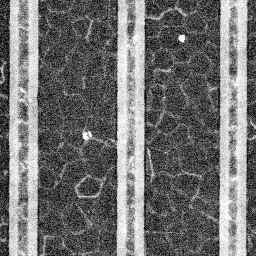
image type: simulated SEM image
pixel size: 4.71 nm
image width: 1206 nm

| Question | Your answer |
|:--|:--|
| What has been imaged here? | one or a few lines or trenches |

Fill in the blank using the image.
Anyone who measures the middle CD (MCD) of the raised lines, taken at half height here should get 85.9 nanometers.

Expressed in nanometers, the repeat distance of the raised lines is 494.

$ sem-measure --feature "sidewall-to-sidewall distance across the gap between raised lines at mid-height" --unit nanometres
407